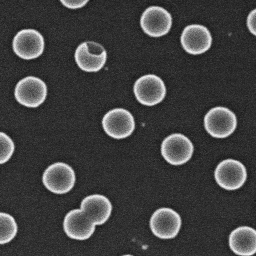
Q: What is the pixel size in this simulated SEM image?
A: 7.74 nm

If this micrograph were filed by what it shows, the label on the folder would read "a regular array of raised bodies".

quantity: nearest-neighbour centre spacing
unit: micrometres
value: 0.381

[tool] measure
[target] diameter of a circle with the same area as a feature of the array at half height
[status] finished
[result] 226 nm